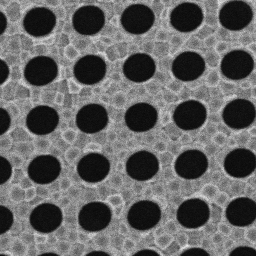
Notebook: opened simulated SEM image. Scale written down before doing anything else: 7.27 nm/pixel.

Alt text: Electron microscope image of a regular array of holes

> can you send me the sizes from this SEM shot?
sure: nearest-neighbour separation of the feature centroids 355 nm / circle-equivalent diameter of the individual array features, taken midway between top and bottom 31.7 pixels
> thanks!